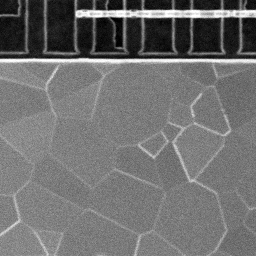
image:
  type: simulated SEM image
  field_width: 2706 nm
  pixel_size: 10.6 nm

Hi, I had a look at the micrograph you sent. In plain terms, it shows wiring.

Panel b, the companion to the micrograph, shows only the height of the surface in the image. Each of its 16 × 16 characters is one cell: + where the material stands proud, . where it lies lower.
................
................
................
................
++++++++++++++++
++++++++++++++++
++++++++++++++++
++++++++++++++++
++++++++++++++++
++++++++++++++++
++++++++++++++++
++++++++++++++++
++++++++++++++++
++++++++++++++++
++++++++++++++++
++++++++++++++++